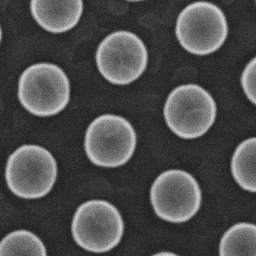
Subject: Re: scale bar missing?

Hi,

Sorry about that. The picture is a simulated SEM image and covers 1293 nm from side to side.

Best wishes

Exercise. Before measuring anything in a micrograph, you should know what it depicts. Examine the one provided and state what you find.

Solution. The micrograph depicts a regular array of raised bodies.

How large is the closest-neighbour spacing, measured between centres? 423 nm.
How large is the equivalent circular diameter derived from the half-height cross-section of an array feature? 252 nm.